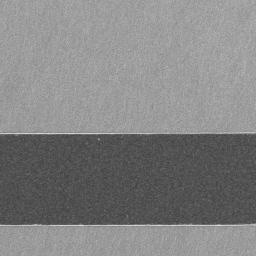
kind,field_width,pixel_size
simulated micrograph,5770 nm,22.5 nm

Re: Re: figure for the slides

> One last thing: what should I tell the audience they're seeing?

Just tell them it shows one or a few lines or trenches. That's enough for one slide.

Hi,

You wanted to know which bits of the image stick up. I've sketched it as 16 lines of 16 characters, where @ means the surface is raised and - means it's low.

----------------
----------------
----------------
----------------
----------------
----------------
----------------
----------------
@@@@@@@@@@@@@@@@
@@@@@@@@@@@@@@@@
@@@@@@@@@@@@@@@@
@@@@@@@@@@@@@@@@
@@@@@@@@@@@@@@@@
@@@@@@@@@@@@@@@@
----------------
----------------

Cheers